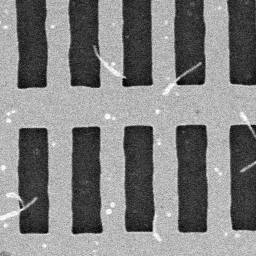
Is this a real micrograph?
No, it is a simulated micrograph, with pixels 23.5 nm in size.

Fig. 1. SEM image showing groups of lines, slits or small figures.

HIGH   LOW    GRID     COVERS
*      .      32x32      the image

**....***...***....***....**....
**....***...***....***....**....
**....***...***....***....**....
**....***...***....***....**....
**....***...***....***....**....
**....***...***....***....***...
**....***....**....***....***...
**....***....**....***....***...
**....***....**....***....***...
**....***....**....***....***...
**....***....**....***...****...
********************************
********************************
********************************
********************************
************************.*****.*
**....***....**....***....***...
**....***....**....***....***...
**....***....**....***....***...
**....***....***...***....***...
**....***....***...***....***...
**....***....***...***....***...
**....***....***...***....***...
**....***....***...***....***...
**....***....***...***....***...
**....***....***...***....***...
***...***....***...***....***...
**....***....***...***....***...
**....***....***...***....***...
********************************
********************************
********************************